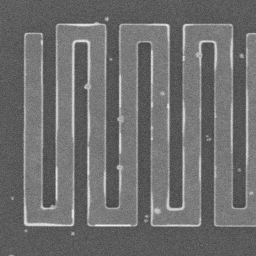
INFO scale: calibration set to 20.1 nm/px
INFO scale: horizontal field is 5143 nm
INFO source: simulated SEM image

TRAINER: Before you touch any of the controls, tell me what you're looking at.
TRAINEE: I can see groups of lines, slits or small figures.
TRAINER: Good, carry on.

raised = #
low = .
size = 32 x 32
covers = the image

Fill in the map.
................................
................................
................................
.......######..######..######...
...##..######..######..######..#
...##..##..##..##..##..##..##..#
...##..##..##..##..##..##..##..#
...##..##..##..##..##..##..##..#
...##..##..##..##..##..##..##..#
...##..##..##..##..##..##..##..#
...##..##..##..##..##..##..##..#
...##..##..##..##..##..##..##..#
...##..##..##..##..##..##..##..#
...##..##..##..##..##..##..##..#
...##..##..##..##..##..##..##..#
...##..##..##..##..##..##..##..#
...##..##..##..##..##..##..##..#
...##..##..##..##..##..##..##..#
...##..##..##..##..##..##..##..#
...##..##..##..##..##..##..##..#
...##..##..##..##..##..##..##..#
...##..##..##..##..##..##..##..#
...##..##..##..##..##..##..##..#
...##..##..##..##..##..##..##..#
...##..##..##..##..##..##..##..#
...##..##..##..##..##..##..##..#
...######..######..######..#####
...######..######..######..#####
................................
................................
................................
................................